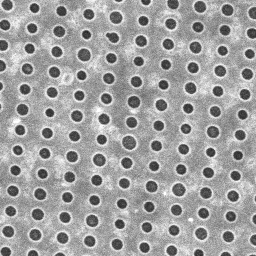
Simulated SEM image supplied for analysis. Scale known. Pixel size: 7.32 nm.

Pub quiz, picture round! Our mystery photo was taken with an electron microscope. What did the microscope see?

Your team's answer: a regular array of holes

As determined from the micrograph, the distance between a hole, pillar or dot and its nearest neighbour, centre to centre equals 0.149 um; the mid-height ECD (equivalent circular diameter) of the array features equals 84.1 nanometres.